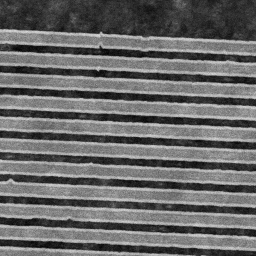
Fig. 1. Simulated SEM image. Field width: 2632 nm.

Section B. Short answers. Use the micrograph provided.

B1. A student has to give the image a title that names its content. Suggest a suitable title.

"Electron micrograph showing parallel lines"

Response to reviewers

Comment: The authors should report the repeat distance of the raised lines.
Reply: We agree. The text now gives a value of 223 nanometers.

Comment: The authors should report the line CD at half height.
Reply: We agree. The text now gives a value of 123 nanometres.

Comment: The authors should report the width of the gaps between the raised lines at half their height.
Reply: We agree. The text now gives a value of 104 nm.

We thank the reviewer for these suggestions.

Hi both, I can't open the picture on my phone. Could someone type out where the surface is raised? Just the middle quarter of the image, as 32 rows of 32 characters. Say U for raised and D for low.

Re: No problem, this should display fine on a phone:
UUUUUUUUUUUUUUUUUUUUUUUUUUUUUUUU
DDDDDDDDDDDDDDDDDUUUUUUUUUUUUUUU
DDDDDDDDDDDDDDDDDDDDDDDDDDDDDDDD
UUUUUUDDDDDDDDDDDDDDDDDDDDDDDDDD
UUUUUUUUUUUUUUUUUUUUUUUUUUUDDDDD
UUUUUUUUUUUUUUUUUUUUUUUUUUUUUUUU
DDDDDDDDDDUUUUUUUUUUUUUUUUUUUUUU
DDDDDDDDDDDDDDDDDDDDDDDDDDDDDDDU
DDDDDDDDDDDDDDDDDDDDDDDDDDDDDDDD
UUUUUUUUUUUUUUUDDDDDDDDDDDDDDDDD
UUUUUUUUUUUUUUUUUUUUUUUUUUUUUUUU
UUUUUUUUUUUUUUUUUUUUUUUUUUUUUUUU
DDDDDDDDDDDDDDDDDDDUUUUUUUUUUUUU
DDDDDDDDDDDDDDDDDDDDDDDDDDDDDDDD
UUUUUUUUDDDDDDDDDDDDDDDDDDDDDDDD
UUUUUUUUUUUUUUUUUUUUUUUUUUUUUDDD
UUUUUUUUUUUUUUUUUUUUUUUUUUUUUUUU
DDDDDDDDDDDDUUUUUUUUUUUUUUUUUUUU
DDDDDDDDDDDDDDDDDDDDDDDDDDDDDDDD
DDDDDDDDDDDDDDDDDDDDDDDDDDDDDDDD
UUUUUUUUUUUUUUUUUUDDDDDDDDDDDDDD
UUUUUUUUUUUUUUUUUUUUUUUUUUUUUUUU
UUUUUUUUUUUUUUUUUUUUUUUUUUUUUUUU
DDDDDDDDDDDDDDDDDDDDDUDDUUUUUUUU
DDDDDDDDDDDDDDDDDDDDDDDDDDDDDDDD
UUUUUUUUUUDDDDDDDDDDDDDDDDDDDDDD
UUUUUUUUUUUUUUUUUUUUUUUUUUUUUUUD
UUUUUUUUUUUUUUUUUUUUUUUUUUUUUUUU
DDDDDDDDDDDDDDUUUUUUUUUUUUUUUUUU
DDDDDDDDDDDDDDDDDDDDDDDDDDDDDDDD
UUDDDDDDDDDDDDDDDDDDDDDDDDDDDDDD
UUUUUUUUUUUUUUUUUUUUUUUUDDDDDDDD